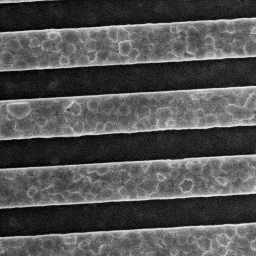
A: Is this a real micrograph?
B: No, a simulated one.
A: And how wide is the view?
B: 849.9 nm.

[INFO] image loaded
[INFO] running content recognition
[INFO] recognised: one or a few lines or trenches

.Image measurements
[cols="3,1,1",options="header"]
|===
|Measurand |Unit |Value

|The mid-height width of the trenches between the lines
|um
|0.1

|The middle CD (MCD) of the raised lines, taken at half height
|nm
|129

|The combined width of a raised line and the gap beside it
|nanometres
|227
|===